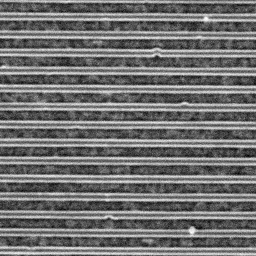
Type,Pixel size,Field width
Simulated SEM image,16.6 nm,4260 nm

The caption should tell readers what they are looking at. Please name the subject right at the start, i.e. parallel lines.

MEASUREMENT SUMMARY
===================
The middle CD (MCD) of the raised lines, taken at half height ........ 102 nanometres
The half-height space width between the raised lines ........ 204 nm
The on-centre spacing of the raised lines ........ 0.299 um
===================